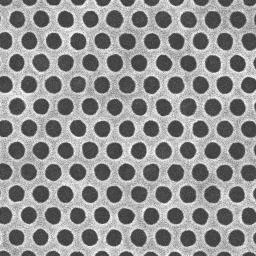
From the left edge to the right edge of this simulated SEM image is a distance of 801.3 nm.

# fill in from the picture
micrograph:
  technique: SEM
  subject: a regular array of holes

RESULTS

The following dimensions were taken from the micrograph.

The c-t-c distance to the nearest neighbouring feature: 0.0761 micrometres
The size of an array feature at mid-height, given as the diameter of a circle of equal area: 52.1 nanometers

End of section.